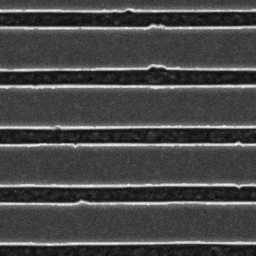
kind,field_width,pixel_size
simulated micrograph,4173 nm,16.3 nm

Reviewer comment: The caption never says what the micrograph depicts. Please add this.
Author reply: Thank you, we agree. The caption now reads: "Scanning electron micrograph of parallel lines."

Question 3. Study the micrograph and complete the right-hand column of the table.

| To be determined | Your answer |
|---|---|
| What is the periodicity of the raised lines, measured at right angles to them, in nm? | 950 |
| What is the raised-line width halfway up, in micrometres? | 0.679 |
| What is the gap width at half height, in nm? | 261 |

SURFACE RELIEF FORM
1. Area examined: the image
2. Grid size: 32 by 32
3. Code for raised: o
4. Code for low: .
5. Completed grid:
oooooooooooooooooooooooooooooooo
................................
................................
..oooooooooooo.o..ooo.oooooooooo
oooooooooooooooooooooooooooooooo
oooooooooooooooooooooooooooooooo
oooooooooooooooooooooooooooooooo
oooooooooooooooooooooooooooooooo
ooooooooooooooooooo..ooooooooooo
................................
................................
oooooooooooooooooooooooooooooooo
oooooooooooooooooooooooooooooooo
oooooooooooooooooooooooooooooooo
oooooooooooooooooooooooooooooooo
oooooooooooooooooooooooooooooooo
................................
................................
oooooooooooooooooooooooooooooooo
oooooooooooooooooooooooooooooooo
oooooooooooooooooooooooooooooooo
oooooooooooooooooooooooooooooooo
oooooooooooooooooooooooooooooooo
................................
................................
ooo.o....ooo.ooooooooooooooooooo
oooooooooooooooooooooooooooooooo
oooooooooooooooooooooooooooooooo
oooooooooooooooooooooooooooooooo
oooooooooooooooooooooooooooooooo
oooo.ooo........................
................................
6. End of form